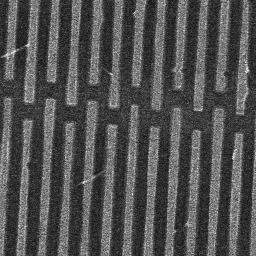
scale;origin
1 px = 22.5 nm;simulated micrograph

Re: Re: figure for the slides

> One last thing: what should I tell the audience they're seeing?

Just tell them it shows parallel lines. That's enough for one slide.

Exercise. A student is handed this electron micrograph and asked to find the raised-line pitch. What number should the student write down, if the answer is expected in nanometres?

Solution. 475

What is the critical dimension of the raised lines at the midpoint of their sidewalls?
190 nm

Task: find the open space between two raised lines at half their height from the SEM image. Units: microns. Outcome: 0.278